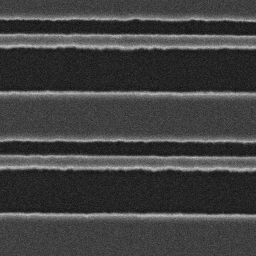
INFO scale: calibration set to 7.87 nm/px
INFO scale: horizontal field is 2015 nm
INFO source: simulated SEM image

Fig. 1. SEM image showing lines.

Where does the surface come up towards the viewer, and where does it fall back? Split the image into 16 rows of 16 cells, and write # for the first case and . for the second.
################
################
################
................
................
................
################
################
################
################
....#..#.#.#####
................
................
###############.
################
################